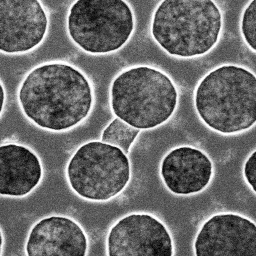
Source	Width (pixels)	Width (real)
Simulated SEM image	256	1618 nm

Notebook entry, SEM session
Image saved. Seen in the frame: holes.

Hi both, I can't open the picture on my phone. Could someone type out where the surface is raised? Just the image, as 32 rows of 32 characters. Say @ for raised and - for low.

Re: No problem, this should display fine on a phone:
-----@@@@-------@@@@-------@@@@-
-----@@@@-------@@@--------@@@@-
------@@@--------@@---------@@--
------@@@--------@@---------@@--
-----@@@@-------@@@--------@@@@-
-----@@@@@-----@@@@@-------@@@@-
@--@@@@@@@@--@@@@@@@@-----@@@@@@
@@@@@@@@@@@@@@@@@@@@@@@@@@@@@@@@
@@@@@----@@@@@@@@--@@@@@@@@---@@
@@@-------@@@@@------@@@@@------
@@@--------@@@--------@@@-------
@@---------@@@--------@@@-------
@@---------@@@--------@@--------
@@@--------@@@--------@@@-------
@@@--------@@@-------@@@@-------
@@@@@-----@@@@------@@@@@@------
@@@@@@@@@@@@@----@@@@@@@@@@@--@@
@@@@@@@@@@@@-----@@@@@@@@@@@@@@@
---@@@@@@@------@@@@@@--@@@@@@@@
----@@@@@-------@@@@@-----@@@@@-
-----@@@@-------@@@@------@@@@@-
-----@@@--------@@@@------@@@@@-
-----@@@@-------@@@@------@@@@@-
----@@@@@------@@@@@@----@@@@@@@
@@@@@@@@@@----@@@@@@@@@@@@@@@@@@
@@@@@@@@@@@@@@@@@@@@@@@@@@@@@@@@
@@@@@@@@@@@@@@@@@@@@@@@@@@@@@@@@
@@@@@----@@@@@@-----@@@@@@-----@
@@@@------@@@@-------@@@@-------
@@@@-------@@@-------@@@@-------
@@@--------@@--------@@@--------
@@@--------@@@--------@@--------